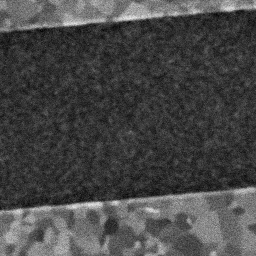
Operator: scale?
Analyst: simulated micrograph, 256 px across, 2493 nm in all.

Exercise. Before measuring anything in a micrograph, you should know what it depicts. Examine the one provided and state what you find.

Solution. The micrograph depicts one or a few lines or trenches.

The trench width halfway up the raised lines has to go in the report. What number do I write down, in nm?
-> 1760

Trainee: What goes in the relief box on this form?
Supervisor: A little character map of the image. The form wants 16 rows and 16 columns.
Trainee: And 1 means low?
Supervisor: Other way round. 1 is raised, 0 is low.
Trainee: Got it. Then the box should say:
1111111111111111
1111100000000000
0000000000000000
0000000000000000
0000000000000000
0000000000000000
0000000000000000
0000000000000000
0000000000000000
0000000000000000
0000000000000000
0000000000000000
0000000011111111
1111111111111111
1111111111111111
1111111111111111